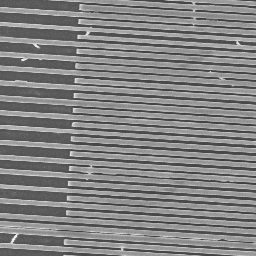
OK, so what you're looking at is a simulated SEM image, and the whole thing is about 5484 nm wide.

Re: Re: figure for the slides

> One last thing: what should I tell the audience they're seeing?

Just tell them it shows parallel lines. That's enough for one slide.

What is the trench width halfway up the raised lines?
2.43 pixels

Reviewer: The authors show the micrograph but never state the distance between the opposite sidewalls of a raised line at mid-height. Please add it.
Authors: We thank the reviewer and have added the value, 0.107 um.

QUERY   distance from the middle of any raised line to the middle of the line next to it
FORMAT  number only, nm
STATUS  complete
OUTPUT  158